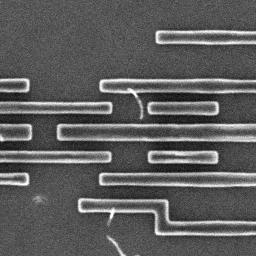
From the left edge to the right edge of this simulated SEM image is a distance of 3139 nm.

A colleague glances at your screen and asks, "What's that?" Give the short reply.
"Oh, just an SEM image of wiring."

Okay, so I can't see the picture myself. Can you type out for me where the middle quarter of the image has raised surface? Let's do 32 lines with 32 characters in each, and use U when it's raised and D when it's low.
DDDDDDDDDDDDDDDDDDDDDDDDDDDDDDDD
DDDDDDDDDDDDDDDDDDDDDDDDDDDDDDDD
DDDDDDDDDDDDDDDDDDDDDDDDDDDDDDDD
DDDDDDDDDDDDDDDDDDDDDDDDDDDDDDDD
DDDDDDDDDUUUUUUUUUUUUUUUUUUUUUUU
DDDDDDDDDUUUUUUUUUUUUUUUUUUUUUUU
DDDDDDDDDUUUUUUUUUUUUUUUUUUUUUUU
DDDDDDDDDDDDDDDDDDDDDDDDDDDDDDDD
DDDDDDDDDDDDDDDDDDDDDDDDDDDDDDDD
DDDDDDDDDDDDDDDDDDDDDDDDDDDDDDDD
UUUUUUUUUUUUDDDDDDDDDUUUUUUUUUUU
UUUUUUUUUUUUDDDDDDDDDUUUUUUUUUUU
DDDDDDDDDDDDDDDDDDDDDDDDDDDDDDDD
DDDDDDDDDDDDDDDDDDDDDDDDDDDDDDDD
DDDDDDDDDDDDDDDDDDDDDDDDDDDDDDDD
UUUUUUUUUUUUUUUUUUUUUUUUUUUUUUUU
UUUUUUUUUUUUUUUUUUUUUUUUUUUUUUUU
UUUUUUUUUUUUUUUUUUUUUUUUUUUUUUUU
UUUUUUUUUUUUUUUUUUUUUUUUUUUUUUUU
DDDDDDDDDDDDDDDDDDDDDDDDDDDDDDDD
DDDDDDDDDDDDDDDDDDDDDDDDDDDDDDDD
DDDDDDDDDDDDDDDDDDDDDDDDDDDDDDDD
UUUUUUUUUUUUDDDDDDDDDUUUUUUUUUUU
UUUUUUUUUUUUDDDDDDDDDUUUUUUUUUUU
DDDDDDDDDDDDDDDDDDDDDDUUUUUUUUUU
DDDDDDDDDDDDDDDDDDDDDDDDDDDDDDDD
DDDDDDDDDDDDDDDDDDDDDDDDDDDDDDDD
DDDDDDDDDUUUUUUUUUUUUUUUUUUUUUUU
DDDDDDDDDUUUUUUUUUUUUUUUUUUUUUUU
DDDDDDDDDUUUUUUUUUUUUUUUUUUUUUUU
DDDDDDDDDDDDDDDDDDDDDDDDDDDDDDDD
DDDDDDDDDDDDDDDDDDDDDDDDDDDDDDDD